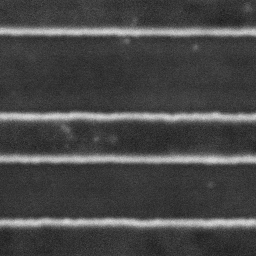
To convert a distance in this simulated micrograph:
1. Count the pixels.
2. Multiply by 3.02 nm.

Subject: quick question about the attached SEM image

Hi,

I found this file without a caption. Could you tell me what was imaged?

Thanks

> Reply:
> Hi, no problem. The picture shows lines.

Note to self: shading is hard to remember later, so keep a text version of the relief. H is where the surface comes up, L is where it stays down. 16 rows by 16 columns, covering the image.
HHHHHHHHHHHHHHHH
HHHHHHHHHHHHHHHH
LLLLLLLLLLLLLLLL
LLLLLLLLLLLLLLLL
LLLLLLLLLLLLLLLL
LLLLLLLLLLLLLLLL
LLLLLLLLLLLLLLLL
HHHHHHHHHHHHHHHH
HHHHHHHHHHHHHHHH
HHHHHHHHHHHHHHHH
LLLLLLLLLLLLLLLL
LLLLLLLLLLLLLLLL
LLLLLLLLLLLLLLLL
LLLLLLLLLLLLLLLL
HHHHHHHHHHHHHHHH
HHHHHHHHHHHHHHHH